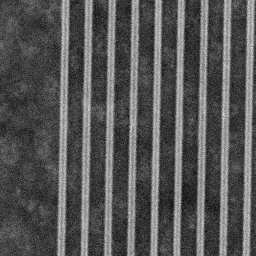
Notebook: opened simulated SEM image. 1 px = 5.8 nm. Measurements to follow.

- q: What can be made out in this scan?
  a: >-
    parallel lines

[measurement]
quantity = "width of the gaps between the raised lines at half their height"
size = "100 nanometres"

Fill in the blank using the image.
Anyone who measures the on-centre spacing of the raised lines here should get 134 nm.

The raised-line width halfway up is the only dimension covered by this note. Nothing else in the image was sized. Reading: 34.8 nanometres